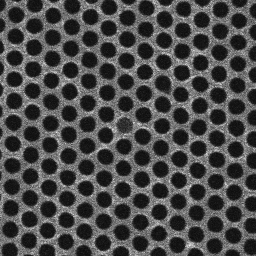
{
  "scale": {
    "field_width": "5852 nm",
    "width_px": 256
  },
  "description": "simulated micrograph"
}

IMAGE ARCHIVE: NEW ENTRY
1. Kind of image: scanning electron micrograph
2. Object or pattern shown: a regular array of holes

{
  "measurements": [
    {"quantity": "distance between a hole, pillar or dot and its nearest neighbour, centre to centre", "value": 483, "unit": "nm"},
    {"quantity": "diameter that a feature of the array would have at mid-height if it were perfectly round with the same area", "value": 372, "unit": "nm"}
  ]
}